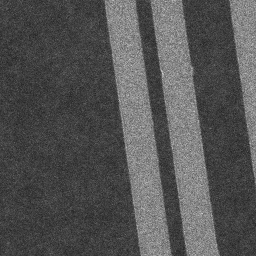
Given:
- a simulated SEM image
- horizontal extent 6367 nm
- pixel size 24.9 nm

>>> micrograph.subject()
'one or a few lines or trenches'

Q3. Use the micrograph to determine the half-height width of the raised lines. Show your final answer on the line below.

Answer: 745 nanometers